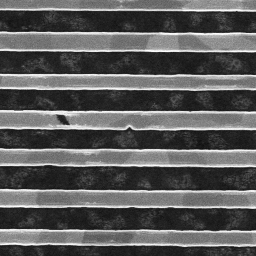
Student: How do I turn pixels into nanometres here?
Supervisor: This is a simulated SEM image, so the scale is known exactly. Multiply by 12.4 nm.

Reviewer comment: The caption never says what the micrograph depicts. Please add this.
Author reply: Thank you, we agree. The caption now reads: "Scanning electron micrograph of parallel lines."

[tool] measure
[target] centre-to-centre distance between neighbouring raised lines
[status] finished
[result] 0.487 µm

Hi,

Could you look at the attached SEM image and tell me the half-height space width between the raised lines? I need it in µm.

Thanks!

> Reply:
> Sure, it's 0.296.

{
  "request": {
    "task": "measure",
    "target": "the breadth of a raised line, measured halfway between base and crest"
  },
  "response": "198 nm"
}